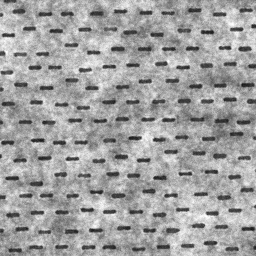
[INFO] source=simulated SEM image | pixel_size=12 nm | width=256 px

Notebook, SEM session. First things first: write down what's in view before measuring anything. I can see a regular array of holes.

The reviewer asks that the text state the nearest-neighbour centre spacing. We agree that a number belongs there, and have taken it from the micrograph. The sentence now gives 230 nm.